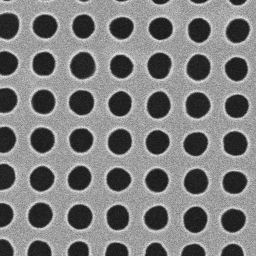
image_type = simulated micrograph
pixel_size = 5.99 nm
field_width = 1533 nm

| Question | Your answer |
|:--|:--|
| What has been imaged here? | a regular array of holes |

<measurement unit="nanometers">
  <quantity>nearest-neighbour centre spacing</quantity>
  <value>225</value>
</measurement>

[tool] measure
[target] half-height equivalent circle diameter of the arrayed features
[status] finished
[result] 146 nm